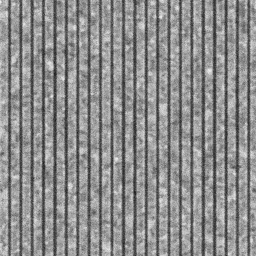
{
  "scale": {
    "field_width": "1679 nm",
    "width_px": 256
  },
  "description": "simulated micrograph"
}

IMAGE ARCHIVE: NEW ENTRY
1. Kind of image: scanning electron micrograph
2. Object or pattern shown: parallel lines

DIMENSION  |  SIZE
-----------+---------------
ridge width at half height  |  45.9 nm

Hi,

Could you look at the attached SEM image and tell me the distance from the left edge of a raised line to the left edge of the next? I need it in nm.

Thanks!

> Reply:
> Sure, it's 74.9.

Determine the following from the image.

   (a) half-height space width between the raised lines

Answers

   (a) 27.9 nm